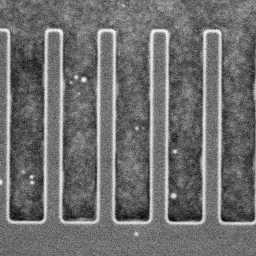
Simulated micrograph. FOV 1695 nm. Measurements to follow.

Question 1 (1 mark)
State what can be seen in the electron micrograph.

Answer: groups of lines, slits or small figures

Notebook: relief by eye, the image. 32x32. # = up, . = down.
................................
................................
................................
................................
#.....##....##.....##.....##....
#.....##....##.....##.....##....
#.....##....##.....##.....##....
#.....##....##.....##.....#.....
#.....##....##.....##.....#.....
#.....##....##.....##....##.....
#.....##....##.....##....##.....
#.....##....##.....##....##.....
#.....##....##.....##....##.....
#.....##....##.....##....##.....
#.....##....##.....##....##.....
#.....##....##.....##....##.....
#.....##....##.....##....##.....
#.....##....##.....##....##.....
#.....##....##.....##....##.....
#.....##....##.....##....##.....
#.....##....##.....##....##.....
#.....##....##.....##....##.....
#.....##....##.....##....##.....
#.....##....##.....##....##.....
#.....##....##.....##....##.....
#.....##....##.....##....##.....
#.....##....##.....##....##.....
#....###....###....##....###....
################################
################################
################################
################################